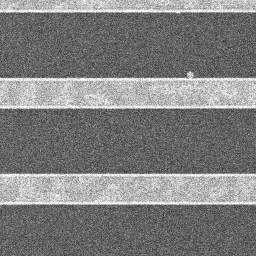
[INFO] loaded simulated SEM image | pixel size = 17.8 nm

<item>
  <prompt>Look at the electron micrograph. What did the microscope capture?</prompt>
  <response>one or a few lines or trenches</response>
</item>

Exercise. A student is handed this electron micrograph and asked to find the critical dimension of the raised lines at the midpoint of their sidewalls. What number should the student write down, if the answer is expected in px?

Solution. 27.7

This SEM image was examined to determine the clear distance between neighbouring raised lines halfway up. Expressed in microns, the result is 1.21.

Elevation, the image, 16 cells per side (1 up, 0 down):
1111111111111111
0000000000000000
0000000000000000
0000000000000000
0000000000000000
1111111111111111
1111111111111111
0000000000000000
0000000000000000
0000000000000000
0000000000000000
1111111111111111
1111111111111111
0000000000000000
0000000000000000
0000000000000000